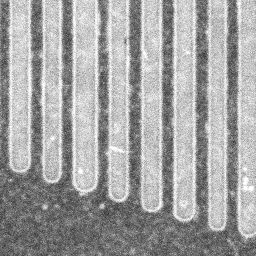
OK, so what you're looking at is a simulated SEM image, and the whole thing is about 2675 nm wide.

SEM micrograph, parallel lines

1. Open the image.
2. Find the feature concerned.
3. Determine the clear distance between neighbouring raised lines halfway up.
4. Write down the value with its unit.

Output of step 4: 179 nm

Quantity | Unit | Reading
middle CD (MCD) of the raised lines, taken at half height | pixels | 14.6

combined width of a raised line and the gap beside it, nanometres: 340